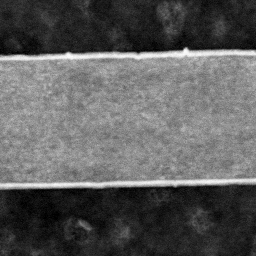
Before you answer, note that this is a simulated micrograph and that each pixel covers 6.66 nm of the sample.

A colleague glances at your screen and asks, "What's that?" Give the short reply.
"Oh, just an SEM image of one or a few lines or trenches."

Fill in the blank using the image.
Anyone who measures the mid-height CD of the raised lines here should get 849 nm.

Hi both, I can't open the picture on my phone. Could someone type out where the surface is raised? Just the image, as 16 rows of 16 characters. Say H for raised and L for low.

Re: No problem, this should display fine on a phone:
LLLLLLLLLLLLLLLL
LLLLLLLLLLLLLLLL
LLLLLLLLLLLLLLLL
LLLLLLLLLHHHHHHH
HHHHHHHHHHHHHHHH
HHHHHHHHHHHHHHHH
HHHHHHHHHHHHHHHH
HHHHHHHHHHHHHHHH
HHHHHHHHHHHHHHHH
HHHHHHHHHHHHHHHH
HHHHHHHHHHHHHHHH
HHHHHHHLLLLLLLLL
LLLLLLLLLLLLLLLL
LLLLLLLLLLLLLLLL
LLLLLLLLLLLLLLLL
LLLLLLLLLLLLLLLL